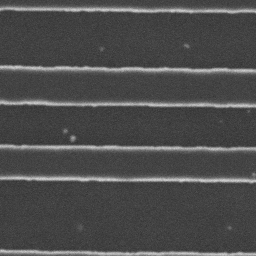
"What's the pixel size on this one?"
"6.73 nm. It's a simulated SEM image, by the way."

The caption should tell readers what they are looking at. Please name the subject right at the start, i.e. lines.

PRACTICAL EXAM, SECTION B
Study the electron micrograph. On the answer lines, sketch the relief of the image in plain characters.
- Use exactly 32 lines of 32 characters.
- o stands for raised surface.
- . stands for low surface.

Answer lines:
oooooooooooooooooooooooooooooooo
................................
................................
................................
................................
................................
................................
................................
ooooo..oo.......................
oooooooooooooooooooooooooooooooo
oooooooooooooooooooooooooooooooo
oooooooooooooooooooooooooooooooo
oooooooooooooooooooooooooooooooo
................................
................................
................................
................................
................................
ooooooooooooooooooooooo.........
oooooooooooooooooooooooooooooooo
oooooooooooooooooooooooooooooooo
oooooooooooooooooooooooooooooooo
..............oooooooooooooooooo
................................
................................
................................
................................
................................
................................
................................
................................
oooooooooooo....................